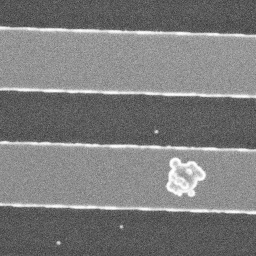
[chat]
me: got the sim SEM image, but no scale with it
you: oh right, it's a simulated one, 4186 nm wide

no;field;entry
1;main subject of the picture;lines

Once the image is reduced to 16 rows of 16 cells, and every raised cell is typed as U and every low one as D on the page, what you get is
DDDDDDDDDDDDDDDD
DDDDDDDDDDDDDDDD
UUUUUUUUUUUUUUUU
UUUUUUUUUUUUUUUU
UUUUUUUUUUUUUUUU
UUUUUUUUUUUUUUUU
DDDDDDDDDDDDDDDD
DDDDDDDDDDDDDDDD
DDDDDDDDDDDDDDDD
UUUUUUUUUUUUUUUU
UUUUUUUUUUUUUUUU
UUUUUUUUUUUUUUUU
UUUUUUUUUUUUUUUU
DDDDDDDDDDDDDDDD
DDDDDDDDDDDDDDDD
DDDDDDDDDDDDDDDD